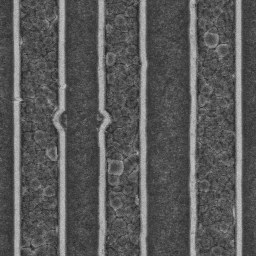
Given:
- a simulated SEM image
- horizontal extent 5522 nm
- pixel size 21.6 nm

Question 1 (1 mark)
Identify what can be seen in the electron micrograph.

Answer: one or a few lines or trenches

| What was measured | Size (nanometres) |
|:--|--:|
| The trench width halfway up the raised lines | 995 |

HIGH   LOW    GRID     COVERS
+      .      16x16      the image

+...++...+++...+
+...++...+++...+
+...++...+++...+
+...++...+++...+
+...++...+++...+
+...++...+++...+
+...++...+++...+
+...+++..+++...+
+...++...+++...+
+...++...+++...+
+...++...+++...+
+...++...+++...+
+...++...+++...+
+...++...+++...+
+...++...+++...+
+...++...+++...+